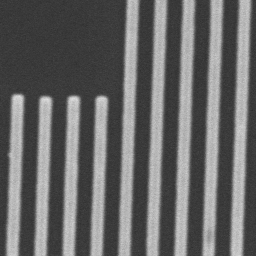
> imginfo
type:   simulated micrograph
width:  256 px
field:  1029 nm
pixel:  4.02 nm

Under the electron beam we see parallel lines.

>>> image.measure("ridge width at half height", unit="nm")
38.7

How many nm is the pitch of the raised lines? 112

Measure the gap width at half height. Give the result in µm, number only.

0.0733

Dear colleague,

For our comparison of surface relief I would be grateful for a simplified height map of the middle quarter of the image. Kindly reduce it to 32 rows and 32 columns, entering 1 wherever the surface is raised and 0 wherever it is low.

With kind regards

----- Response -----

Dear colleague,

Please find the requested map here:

00000000000000011100000110000111
00000000000000011100000110000011
00000000000000011100000110000111
00000000000000011100001110000111
00000000000000011100001110000011
00000000000000011000001110000111
00000000000000011000001110000111
00000000000000011000001110000111
00100000110000011000001100000111
01110000111000011000001110000111
01110000111000011100001100000110
01110000111000011000001100000110
01100000110000011000001100000110
01100000110000011000001100000110
01100000110000011000001100000110
01100000110000011000001100000110
01100000110000011000001100000110
01100000110000011000001100000110
01100000110000011000001100000110
01100000110000011000001100000110
01100000110000011000001100000110
01100000110000011000001100000110
01100000110000011000001100000110
01100000110000011000001100000110
01100000110000011000001100000110
01100000110000011000001100000110
01100000110000011000001100000110
01100000110000011000011100000110
01100000110000111000011100001110
11100000110000111000011100001110
11100001110000111000011100000110
11100001110000111000011100000110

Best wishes